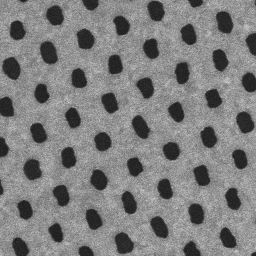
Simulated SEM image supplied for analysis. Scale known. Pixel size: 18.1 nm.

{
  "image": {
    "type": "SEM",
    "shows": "a regular array of holes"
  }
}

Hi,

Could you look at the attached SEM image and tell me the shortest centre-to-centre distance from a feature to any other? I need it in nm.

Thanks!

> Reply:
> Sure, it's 689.